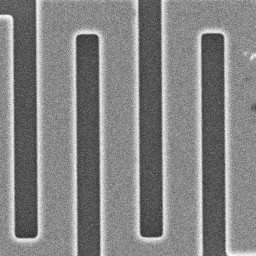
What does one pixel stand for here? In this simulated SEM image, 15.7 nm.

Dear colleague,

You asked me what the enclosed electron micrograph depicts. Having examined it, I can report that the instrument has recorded groups of lines, slits or small figures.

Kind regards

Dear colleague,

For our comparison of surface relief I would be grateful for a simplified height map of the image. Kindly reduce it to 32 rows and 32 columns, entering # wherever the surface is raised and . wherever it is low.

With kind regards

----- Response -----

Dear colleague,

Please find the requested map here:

.....############...############
.....############...############
##...############...############
##...############...############
##...#####..#####...#####...####
##...####...#####...#####...####
##...####...#####...#####...####
##...####...#####...#####...####
##...####...#####...#####...####
##...####...#####...#####...####
##...####...#####...#####...####
##...####....####...#####...####
##...####....####...#####...####
##...####....####...#####...####
##...####....####...#####...####
##...####....####...#####...####
##...####....####...#####...####
##...####....####...#####...####
##...####....####...#####...####
##...####....####...#####...####
##...#####...####...#####...####
##...#####...####...#####...####
##...#####...####...#####...####
##...#####...####...#####...####
##...#####...####...#####...####
##...#####...####...#####...####
##...#####...####...#####...####
##...#####...####...#####...####
##...#####...####...#####...####
##..######...#####..#####...####
##########...############...####
##########...############...####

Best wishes